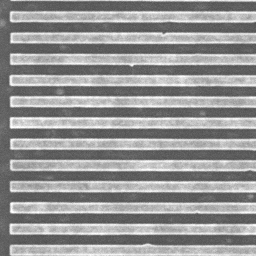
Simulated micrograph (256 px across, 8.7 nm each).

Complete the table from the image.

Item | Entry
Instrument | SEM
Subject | parallel lines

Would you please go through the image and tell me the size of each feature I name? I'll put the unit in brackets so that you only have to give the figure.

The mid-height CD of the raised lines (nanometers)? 78.3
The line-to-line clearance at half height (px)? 11.7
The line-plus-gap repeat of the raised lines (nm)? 184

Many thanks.